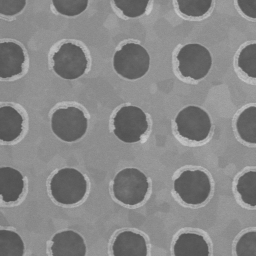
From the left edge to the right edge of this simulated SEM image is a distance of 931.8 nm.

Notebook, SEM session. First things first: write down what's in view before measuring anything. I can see a regular array of holes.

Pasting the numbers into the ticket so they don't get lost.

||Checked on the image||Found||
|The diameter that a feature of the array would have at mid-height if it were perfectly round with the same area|130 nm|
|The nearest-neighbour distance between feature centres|226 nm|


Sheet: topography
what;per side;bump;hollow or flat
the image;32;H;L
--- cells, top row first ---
LLLHHHHLLLLHHHLLLLHHHHLLLLHHHHLL
LLLHHHHLLLHHHHHLLLHHHHHLLLHHHHLL
HHHHHHHHHHHHHHHHHHHHHHHHHHHHHHHH
HHHHHHHHHHHHHHHHHHHHHHHHHHHHHHHH
HHHHHHHHHHHHHHHHHHHHHHHHHHHHHHHH
LLHHHHHHLHHHHHHHLHHHHHHHHHHHHHHL
LLLHHHHLLLHHHHHLLLHHHHLLLLHHHHLL
LLLHHHHLLLLHHHLLLLLHHHLLLLLHHHLL
LLLHHHHLLLLHHHLLLLLHHHLLLLHHHHLL
LLHHHHHLLLHHHHHLLLHHHHHLLLHHHHHL
HHHHHHHHHHHHHHHHHHHHHHHHHHHHHHHH
HHHHHHHHHHHHHHHHHHHHHHHHHHHHHHHH
HHHHHHHHHHHHHHHHHHHHHHHHHHHHHHHH
LLHHHHHHLHHHHHHLLHHHHHHLLHHHHHHL
LLLHHHLLLLLHHHLLLLHHHHLLLLHHHHLL
LLLHHHLLLLLHHHLLLLHHHHLLLLHHHHLL
LLLHHHHLLLLHHHLLLLHHHHLLLLHHHHLL
LLHHHHHHLLHHHHHLLHHHHHHHLHHHHHLL
HHHHHHHHHHHHHHHHHHHHHHHHHHHHHHHH
HHHHHHHHHHHHHHHHHHHHHHHHHHHHHHHH
HHHHHHHHHHHHHHHHHHHHHHHHHHHHHHHH
LLHHHHHLLLHHHHHLLLHHHHHLLHHHHHHL
LLLHHHLLLLLHHHLLLLHHHHLLLLHHHHLL
LLLHHHLLLLLHHHLLLLHHHHLLLLHHHHLL
LLHHHHHLLLHHHHLLLLHHHHLLLLHHHHLL
HHHHHHHHLHHHHHHHLHHHHHHHLHHHHHHL
HHHHHHHHHHHHHHHHHHHHHHHHHHHHHHHH
HHHHHHHHHHHHHHHHHHHHHHHHHHHHHHHH
HHHHHHHHHHHHHHHHHHHHHHHHHHHHHHHH
LLHHHHHLLLHHHHHLLLHHHHHLLHHHHHLL
LLLHHHHLLLLHHHLLLLHHHHLLLLHHHLLL
LLLHHHHLLLLHHHLLLLHHHHLLLLHHHLLL